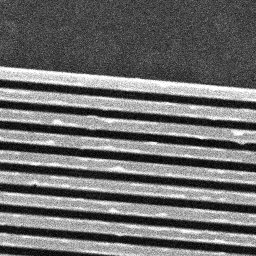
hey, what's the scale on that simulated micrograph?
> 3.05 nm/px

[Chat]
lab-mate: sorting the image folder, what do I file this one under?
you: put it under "parallel lines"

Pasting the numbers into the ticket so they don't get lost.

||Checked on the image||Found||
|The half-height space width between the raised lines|25.4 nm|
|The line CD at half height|0.0398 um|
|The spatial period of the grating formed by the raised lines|63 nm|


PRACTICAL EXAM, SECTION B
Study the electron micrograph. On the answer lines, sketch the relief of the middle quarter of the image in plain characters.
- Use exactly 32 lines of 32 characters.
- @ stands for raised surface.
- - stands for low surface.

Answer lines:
--------------------------------
--------------------------------
@@@@----------------------------
@@@@@@@@@@@@@@@@----------------
@@@@@@@@@@@@@@@@@@@@@@@@@@@-----
---@@@@@@@@@@@@@@@@@@@@@@@@@@@@@
--------------@@@@@@@@@@@@@@@@@@
--------------------------@@@@@@
@@@@@@@@@@@---------------------
@@@@@@@@@@@@@@@@@@@@@@--@-------
-@@@@@@@@@@@@@@@@@@@@@@@@@@@@@@@
----------@--@@@@@@@@@@@@@@@@@@@
@-----------------------@@@@@@@@
@@@@@@@@@@@@--------------------
@@@@@@@@@@@@@@@@@@@@@@@---------
@@@@@@@@@@@@@@@@@@@@@@@@@@@@@@@@
-----------@@@@@@@@@@@@@@@@@@@@@
----------------------@@@@@@@@@@
@@@@@@@@------------------------
@@@@@@@@@@@@@@@@@@@-@-@---------
@@@@@@@@@@@@@@@@@@@@@@@@@@@@@@--
---------@@@@@@@@@@@@@@@@@@@@@@@
--------------------@@@@@@@@@@@@
@@@@@@--------------------------
@@@@@@@@@@@@@@@@@---------------
@@@@@@@@@@@@@@@@@@@@@@@@@@@@----
-------@@@@@@@@@@@@@@@@@@@@@@@@@
-------------------@@@@@@@@@@@@@
@@@@--------------------------@@
@@@@@@@@@@@@@@@-----------------
@@@@@@@@@@@@@@@@@@@@@@@@@@@-----
-----@@@@@@@@@@@@@@@@@@@@@@@@@@@